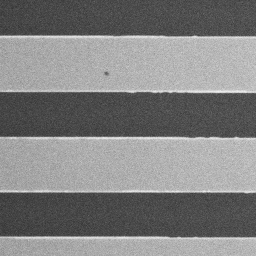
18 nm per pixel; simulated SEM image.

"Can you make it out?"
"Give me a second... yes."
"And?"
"lines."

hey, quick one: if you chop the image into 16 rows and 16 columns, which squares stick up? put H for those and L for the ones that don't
LLLLLLLLLLLLLLLL
LLLLLLLLLLLLLLLL
HHHHHHHHHHHHHHHH
HHHHHHHHHHHHHHHH
HHHHHHHHHHHHHHHH
HHHHHHHHHHHHHHHH
LLLLLLLLLLLLLLLL
LLLLLLLLLLLLLLLL
LLLLLLLLLLLLLLLL
HHHHHHHHHHHHHHHH
HHHHHHHHHHHHHHHH
HHHHHHHHHHHHHHHH
LLLLLLLLLLLLLLLL
LLLLLLLLLLLLLLLL
LLLLLLLLLLLLLLLL
HHHHHHHHHHHHHHHH